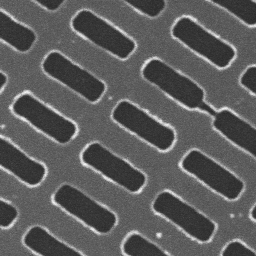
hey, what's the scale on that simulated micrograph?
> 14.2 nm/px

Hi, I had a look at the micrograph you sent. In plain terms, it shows a regular array of holes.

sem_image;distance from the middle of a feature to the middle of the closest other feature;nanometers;726